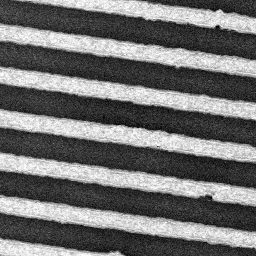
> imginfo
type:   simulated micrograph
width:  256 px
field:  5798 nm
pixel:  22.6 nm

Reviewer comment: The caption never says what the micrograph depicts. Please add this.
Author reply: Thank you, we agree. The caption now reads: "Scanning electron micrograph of parallel lines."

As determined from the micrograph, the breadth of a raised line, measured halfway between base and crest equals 336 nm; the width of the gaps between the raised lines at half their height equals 0.622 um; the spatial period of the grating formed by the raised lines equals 965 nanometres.